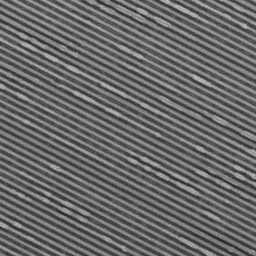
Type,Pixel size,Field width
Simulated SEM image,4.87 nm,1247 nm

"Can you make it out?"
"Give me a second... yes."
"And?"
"parallel lines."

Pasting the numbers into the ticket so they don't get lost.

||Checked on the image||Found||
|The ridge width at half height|0.0124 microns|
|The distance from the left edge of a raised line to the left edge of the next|33.3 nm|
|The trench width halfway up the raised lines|0.0206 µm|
